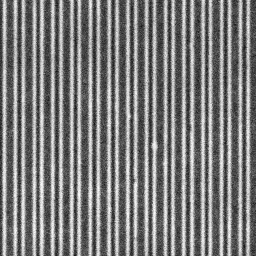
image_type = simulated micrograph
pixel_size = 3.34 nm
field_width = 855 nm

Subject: parallel lines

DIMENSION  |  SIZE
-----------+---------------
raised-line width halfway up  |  9.2 nanometres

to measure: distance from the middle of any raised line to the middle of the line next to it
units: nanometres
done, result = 31.3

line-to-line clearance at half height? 6.38 px